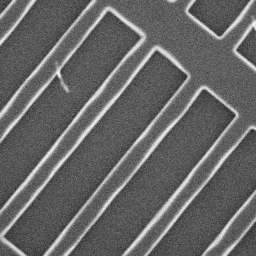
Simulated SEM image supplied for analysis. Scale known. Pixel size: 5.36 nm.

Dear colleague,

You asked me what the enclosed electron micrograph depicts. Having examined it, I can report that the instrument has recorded groups of lines, slits or small figures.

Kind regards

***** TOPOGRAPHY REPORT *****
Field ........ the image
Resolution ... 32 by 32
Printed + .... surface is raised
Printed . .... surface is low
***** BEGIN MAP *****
.+++.......+++++++++++++.......+
+++.......+++.++++++++++......++
+++.......++...++++++++++.....++
++.......+++.....+++++++++...+++
+.......+++.......+++++++++.+++.
.......+++.......+++++++++++++..
......+++.......+++.++++++++++..
.....+++.......+++....+++++++++.
.....+++......+++......+++++++++
....+++.......+++......+++++++++
...+++.......+++.......+++++++++
..+++.......+++.......+++.++++++
.+++.......+++.......+++...+++++
.+++......+++.......+++......+++
+++.......+++.......+++......+++
++.......+++.......+++.......+++
+.......+++.......+++.......+++.
.......+++.......+++.......+++..
.......++.......+++.......+++...
......++.......+++........++....
.....+++.......+++.......+++....
....+++.......+++.......+++.....
...+++.......+++.......+++......
...++.......+++.......+++.......
..++.......+++........++.......+
.+++.......++........+++.......+
+++.......+++.......+++.......++
++.......+++.......+++.......+++
+.......+++.......+++.......+++.
+.......++........++.......+++..
+......+++.......+++.......+++..
+++...+++.......+++.......+++...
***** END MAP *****